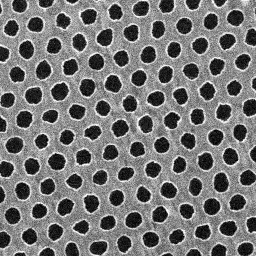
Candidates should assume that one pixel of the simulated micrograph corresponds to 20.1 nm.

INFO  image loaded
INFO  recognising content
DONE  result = a regular array of holes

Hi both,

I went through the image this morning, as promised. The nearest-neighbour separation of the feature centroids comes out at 517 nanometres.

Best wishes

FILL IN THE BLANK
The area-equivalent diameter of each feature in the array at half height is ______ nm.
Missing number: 329